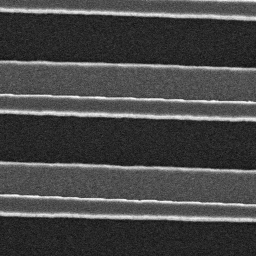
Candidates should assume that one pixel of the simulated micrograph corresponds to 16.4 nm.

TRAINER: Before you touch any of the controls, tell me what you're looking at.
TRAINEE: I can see lines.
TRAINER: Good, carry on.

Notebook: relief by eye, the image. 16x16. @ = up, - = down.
@@@@@@@@@@@@@@@@
----------------
----------------
----------------
@@@@@@@@@@@@@@@@
@@@@@@@@@@@@@@@@
@@@@@@@@@@@@@@@@
----------------
----------------
----------------
@@@@@@@@--------
@@@@@@@@@@@@@@@@
@@@@@@@@@@@@@@@@
------@@@@@@@@@@
----------------
----------------